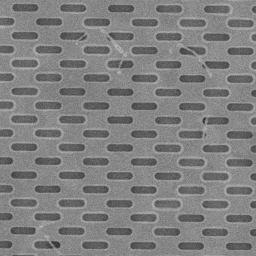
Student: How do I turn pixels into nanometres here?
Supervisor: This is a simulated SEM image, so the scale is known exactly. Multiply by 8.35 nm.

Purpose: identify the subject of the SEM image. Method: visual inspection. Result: groups of lines, slits or small figures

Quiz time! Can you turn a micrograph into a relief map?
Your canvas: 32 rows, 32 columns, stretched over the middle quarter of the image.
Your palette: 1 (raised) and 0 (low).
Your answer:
00000011111000000111111000000111
11111111111111111111111111111111
11111000000111111100000111111111
11111000000011111000000011111000
11111100000111111100000111111000
11111111111111111111111111111111
00000111111000000111111000000111
00000111111000000111111000000111
11111111111111111111111111111111
11111000001111111101111111111111
11111000000111111000000111111000
11111000000111111000000111111000
11111111111111111111111111111111
00000111111000000111111000000111
00000111111000000111111000000111
11111111111111111111111111111111
11111000001111111111111111111000
11111000000011111000000011110000
11111110001111111100000111111000
11111111111111111111111111111111
00000111111000000111111000000111
00000111111000000111110000000111
11111111111111111111111111111111
11111000000111111000000111111000
11111000000111111000000111110000
11111110001111111100001111111000
11111111111111111111111111111111
00000111111000000111111000000111
00000111111000000111111000000111
11111111111111111111111111111111
11111000000111111000001111111000
11111000000111111000000111110000